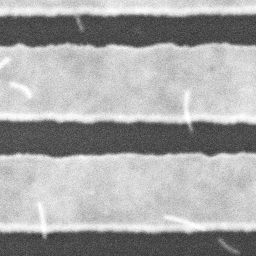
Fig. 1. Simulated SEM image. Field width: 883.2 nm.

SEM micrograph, lines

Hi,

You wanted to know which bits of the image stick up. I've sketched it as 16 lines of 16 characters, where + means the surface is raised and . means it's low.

++++++++++++++++
................
................
++++++++++++++++
++++++++++++++++
++++++++++++++++
++++++++++++++++
.....+....++.+++
................
................
++++++++++++++++
++++++++++++++++
++++++++++++++++
++++++++++++++++
................
................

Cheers